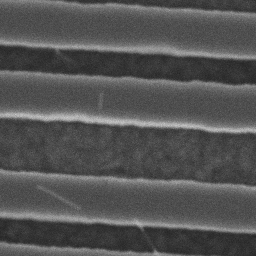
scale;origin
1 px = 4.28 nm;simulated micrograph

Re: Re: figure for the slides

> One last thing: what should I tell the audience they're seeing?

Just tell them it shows lines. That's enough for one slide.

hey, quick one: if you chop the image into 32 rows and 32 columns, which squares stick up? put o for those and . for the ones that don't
oooooooooo...oo.................
oooooooooooooooooooooooooooo....
oooooooooooooooooooooooooooooooo
oooooooooooooooooooooooooooooooo
oooooooooooooooooooooooooooooooo
oooooooooooooooooooooooooooooooo
.................ooooooooooooooo
................................
................................
ooooooooooo.....................
oooooooooooooooooooooooooooo....
oooooooooooooooooooooooooooooooo
oooooooooooooooooooooooooooooooo
oooooooooooooooooooooooooooooooo
oooooooooooooooooooooooooooooooo
...............ooooooooooooooooo
.............................o..
................................
................................
................................
................................
ooo.............................
oooooooooooooooo.o..............
oooooooooooooooooooooooooooooooo
oooooooooooooooooooooooooooooooo
oooooooooooooooooooooooooooooooo
oooooooooooooooooooooooooooooooo
.......ooooooooooooooooooooooooo
......................oooooooooo
................................
o...............................
ooooooooooooooo.o...............